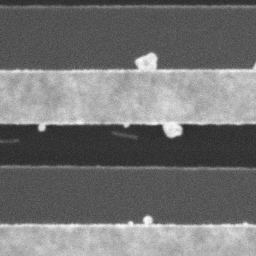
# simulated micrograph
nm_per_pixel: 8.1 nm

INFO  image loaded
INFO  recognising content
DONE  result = lines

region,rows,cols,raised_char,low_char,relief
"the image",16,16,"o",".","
oooooooooooooooo
oooooooooooooooo
oooooooooooooooo
oooooooooooooooo
oooooooooooooooo
oooooooooooooooo
oooooooooooooooo
oooooooooooooooo
................
................
oooooooo.o......
oooooooooooooooo
oooooooooooooooo
oooooooooooooooo
oooooooooooooooo
oooooooooooooooo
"